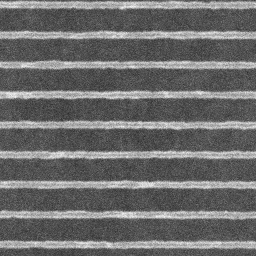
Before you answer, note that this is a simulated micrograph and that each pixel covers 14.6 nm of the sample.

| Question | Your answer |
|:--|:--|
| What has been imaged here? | parallel lines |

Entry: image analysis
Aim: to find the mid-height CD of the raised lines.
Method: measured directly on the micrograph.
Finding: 74.8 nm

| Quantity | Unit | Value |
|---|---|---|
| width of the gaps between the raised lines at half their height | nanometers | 359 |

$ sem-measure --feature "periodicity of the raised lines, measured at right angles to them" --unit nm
437